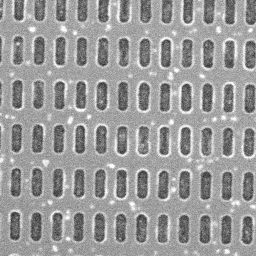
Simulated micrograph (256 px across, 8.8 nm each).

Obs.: a regular array of holes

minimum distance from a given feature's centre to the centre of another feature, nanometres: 184